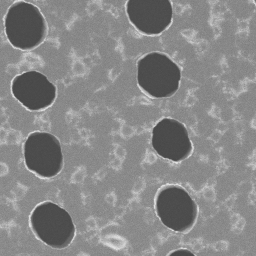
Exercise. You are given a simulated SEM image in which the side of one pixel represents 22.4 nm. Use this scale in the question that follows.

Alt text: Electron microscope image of holes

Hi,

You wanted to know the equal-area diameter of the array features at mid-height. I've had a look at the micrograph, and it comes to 929 nm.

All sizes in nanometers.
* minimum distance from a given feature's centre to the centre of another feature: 1470